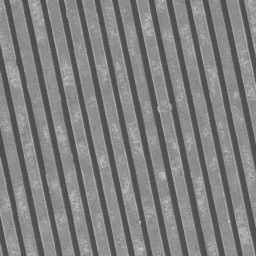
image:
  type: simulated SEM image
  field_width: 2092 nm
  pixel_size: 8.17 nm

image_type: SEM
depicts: parallel lines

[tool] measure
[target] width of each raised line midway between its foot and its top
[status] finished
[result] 90 nm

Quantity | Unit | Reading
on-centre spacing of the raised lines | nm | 144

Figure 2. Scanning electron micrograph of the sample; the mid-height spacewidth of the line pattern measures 0.052 um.